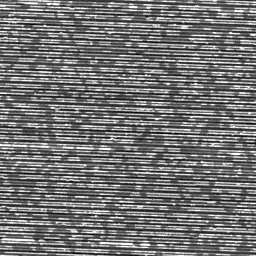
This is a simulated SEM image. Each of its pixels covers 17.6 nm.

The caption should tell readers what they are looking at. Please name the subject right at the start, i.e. parallel lines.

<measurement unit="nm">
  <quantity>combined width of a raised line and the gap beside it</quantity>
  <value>114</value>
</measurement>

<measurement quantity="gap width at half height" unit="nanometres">43.9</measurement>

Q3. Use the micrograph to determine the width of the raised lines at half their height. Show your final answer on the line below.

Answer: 59.3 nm